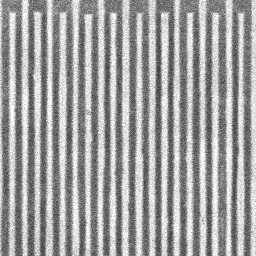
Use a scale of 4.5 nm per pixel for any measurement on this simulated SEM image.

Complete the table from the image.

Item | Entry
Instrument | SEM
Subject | parallel lines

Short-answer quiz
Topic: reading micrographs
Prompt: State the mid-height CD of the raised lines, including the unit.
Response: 26.4 nm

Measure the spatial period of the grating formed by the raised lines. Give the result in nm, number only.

57.2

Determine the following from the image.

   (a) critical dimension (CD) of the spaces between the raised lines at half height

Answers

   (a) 30.9 nm